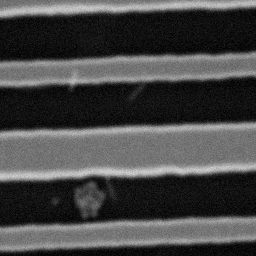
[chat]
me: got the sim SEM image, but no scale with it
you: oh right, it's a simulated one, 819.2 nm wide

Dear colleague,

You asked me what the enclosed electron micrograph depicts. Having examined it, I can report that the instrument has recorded lines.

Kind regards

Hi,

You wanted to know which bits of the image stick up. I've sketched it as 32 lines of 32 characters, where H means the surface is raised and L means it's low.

HHHHHHHHHHHHHHHHHHHHHHHHHHHHHHHH
HHHHHHHLLLLLLLLLLLLLLLLLLLLLLLLL
LLLLLLLLLLLLLLLLLLLLLLLLLLLLLLLL
LLLLLLLLLLLLLLLLLLLLLLLLLLLLLLLL
LLLLLLLLLLLLLLLLLLLLLLLLLLLLLLLL
LLLLLLLLLLLLLLLLLLLLLLLLLLLLLLLL
LLLLLLLLLLLLLLLLLLLLLLLLLLLLLLLL
LLLLLLLLLLHHHHHHHHHHHHHHHHHHHHHH
HHHHHHHHHHHHHHHHHHHHHHHHHHHHHHHH
HHHHHHHHHHHHHHHHHHHHHHHHHHHHHHHL
HHHHHLLLHHLLLLLLLLLLLLLLLLLLLLLL
LLLLLLLLLLLLLLLLLLLLLLLLLLLLLLLL
LLLLLLLLLLLLLLLLLLLLLLLLLLLLLLLL
LLLLLLLLLLLLLLLLLLLLLLLLLLLLLLLL
LLLLLLLLLLLLLLLLLLLLLLLLLLLLLLLL
LLLLLLLLLLLLLLLLLLLLLLLLLLLLLLLH
HHHHHHHHHHHHHHHHHHHHHHHHHHHHHHHH
HHHHHHHHHHHHHHHHHHHHHHHHHHHHHHHH
HHHHHHHHHHHHHHHHHHHHHHHHHHHHHHHH
HHHHHHHHHHHHHHHHHHHHHHHHHHHHHHHH
HHHHHHHHHHHHHHHHHHHHHHHHHHHHHHHH
HHHHHHHHHHHHHHHHHHHHHLHHHLLLLLLL
LLLLLLLLLLLLLLLLLLLLLLLLLLLLLLLL
LLLLLLLLLLLLLLLLLLLLLLLLLLLLLLLL
LLLLLLLLLLLLLLLLLLLLLLLLLLLLLLLL
LLLLLLLLLLLLLLLLLLLLLLLLLLLLLLLL
LLLLLLLLLLLLLLLLLLLLLLLLLLLLLLLL
LLLLLLLLLLLLLLLLLLLLLHHHHHHHHHHH
HHHHHHHHHHHHHHHHHHHHHHHHHHHHHHHH
HHHHHHHHHHHHHHHHHHHHHHHHHHHHHHHH
HHHHHHHHHHHHHHHHHHHHLLLLLLLLLLLL
LLLLLLLLLLLLLLLLLLLLLLLLLLLLLLLL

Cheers